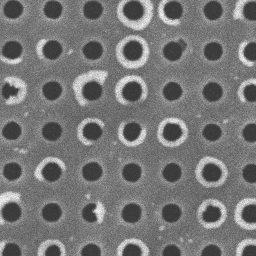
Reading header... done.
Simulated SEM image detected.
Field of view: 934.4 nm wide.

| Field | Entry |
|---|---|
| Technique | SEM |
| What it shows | a regular array of holes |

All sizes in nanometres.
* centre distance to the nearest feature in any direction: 146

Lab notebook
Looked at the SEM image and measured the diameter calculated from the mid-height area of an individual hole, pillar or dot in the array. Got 69.5 nm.